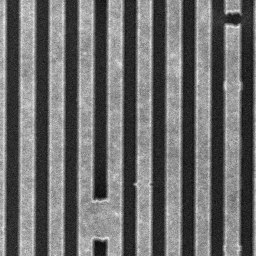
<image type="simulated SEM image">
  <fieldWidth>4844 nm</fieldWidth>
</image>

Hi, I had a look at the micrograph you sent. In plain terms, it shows parallel lines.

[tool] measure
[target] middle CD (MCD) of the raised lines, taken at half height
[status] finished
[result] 291 nm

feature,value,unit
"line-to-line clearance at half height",272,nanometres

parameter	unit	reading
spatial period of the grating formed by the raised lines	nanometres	554